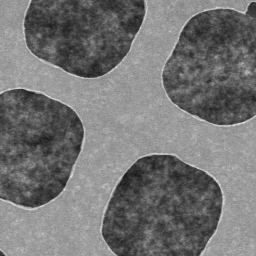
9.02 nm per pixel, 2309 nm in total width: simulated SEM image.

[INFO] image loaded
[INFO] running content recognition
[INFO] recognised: holes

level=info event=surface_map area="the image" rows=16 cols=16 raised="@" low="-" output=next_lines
@@-------@@@@@@-
@@-------@@@----
@@------@@@-----
@@------@@@-----
@@@@---@@@------
@@@@@@@@@@------
----@@@@@@@-----
-----@@@@@@@@--@
-----@@@@@@@@@@@
-----@@@@@@@@@@@
-----@@@----@@@@
----@@@-------@@
---@@@@-------@@
@@@@@@@-------@@
@@@@@@-------@@@
@@@@@@@------@@@